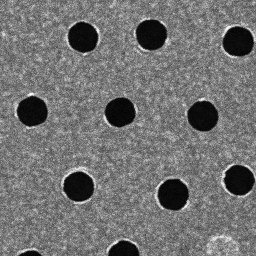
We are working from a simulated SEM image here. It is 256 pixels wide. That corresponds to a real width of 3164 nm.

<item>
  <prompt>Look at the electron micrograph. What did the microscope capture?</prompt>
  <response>a regular array of holes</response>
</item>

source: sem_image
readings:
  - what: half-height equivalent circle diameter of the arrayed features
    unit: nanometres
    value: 384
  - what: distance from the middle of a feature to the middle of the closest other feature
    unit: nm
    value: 908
